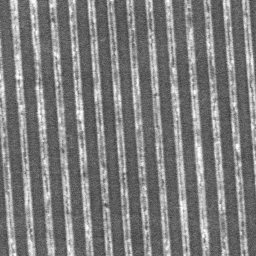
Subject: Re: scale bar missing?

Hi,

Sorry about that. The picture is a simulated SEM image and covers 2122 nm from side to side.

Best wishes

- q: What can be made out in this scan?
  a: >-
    parallel lines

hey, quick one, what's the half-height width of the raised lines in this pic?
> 48.6 nm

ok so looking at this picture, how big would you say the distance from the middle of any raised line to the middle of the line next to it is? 160 nanometres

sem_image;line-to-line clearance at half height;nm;113